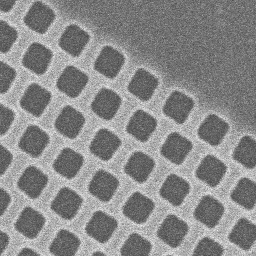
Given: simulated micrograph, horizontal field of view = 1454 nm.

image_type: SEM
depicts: a regular array of holes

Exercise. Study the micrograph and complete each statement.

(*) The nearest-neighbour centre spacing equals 232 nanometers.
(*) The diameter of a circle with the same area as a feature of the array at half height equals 176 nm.